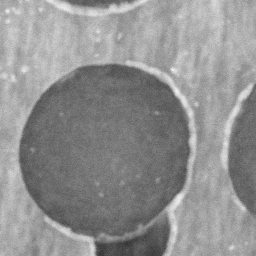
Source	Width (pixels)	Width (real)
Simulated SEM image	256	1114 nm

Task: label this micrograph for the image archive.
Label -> holes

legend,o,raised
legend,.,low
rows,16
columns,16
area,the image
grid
ooooo..ooooooooo
oooooooooooooooo
oooooooooooooooo
oooooooooooooooo
oooo.....ooooooo
ooo........ooooo
oo.........oooo.
oo..........ooo.
o...........oo..
o...........oo..
o...........oo..
oo..........oo..
oo.........oooo.
ooo........ooooo
ooooo......ooooo
oooooo....oooooo